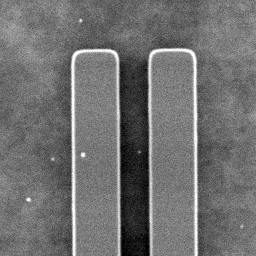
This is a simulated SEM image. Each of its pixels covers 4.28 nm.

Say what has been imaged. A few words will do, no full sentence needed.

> groups of lines, slits or small figures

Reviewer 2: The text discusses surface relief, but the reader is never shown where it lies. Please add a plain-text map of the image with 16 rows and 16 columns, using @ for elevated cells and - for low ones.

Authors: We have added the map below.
----------------
----------------
----------------
-----@@---@@----
-----@@--@@@----
-----@@--@@@----
-----@@--@@@----
-----@@--@@@----
-----@@--@@@----
-----@@--@@@----
-----@@--@@@----
-----@@--@@@----
-----@@--@@@----
-----@@--@@@----
-----@@--@@@----
-----@@--@@@----